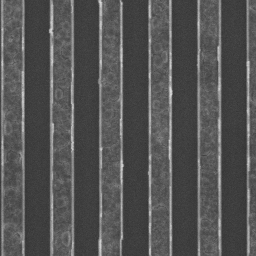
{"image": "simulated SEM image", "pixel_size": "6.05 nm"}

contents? parallel lines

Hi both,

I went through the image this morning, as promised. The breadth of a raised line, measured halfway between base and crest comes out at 132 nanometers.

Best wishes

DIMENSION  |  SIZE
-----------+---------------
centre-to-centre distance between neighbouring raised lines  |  298 nanometres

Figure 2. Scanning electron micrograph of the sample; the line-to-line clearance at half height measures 27.1 px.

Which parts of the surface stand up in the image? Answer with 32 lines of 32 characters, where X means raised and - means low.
XXX---XXX---XXX----XX----XX----X
XXX---XXX----XX----XX----XX----X
XXX---XXX----XX----XX----XX----X
XXX---XXX----XX----XX----XX----X
XXX---XXX----XX----XX----XX----X
XXX---XXX----XX----XX----XX----X
XXX---XXX----XX----XX----XX----X
XXX---XXX----XX----XX----XX----X
XXX---XXX----XX----XX----XX----X
XXX---XXX---XXX----XX----XX----X
XXX---XXX---XXX----XX----XX----X
XXX---XXX----XX----XX----XX----X
XXX---XXX----XX----XX----XX----X
XXX---XXX----XX----XX----XX----X
XXX---XXX----XX----XX----XX----X
XXX---XXX----XX----XX----XX----X
XXX---XXX----XX----XX----XX----X
XXX---XXX----XX----XX----XX----X
XXX---XXX----XX----XX----XX----X
XXX---XXX----XX----XX----XX----X
XXX---XXX----XX----XX----XX----X
XXX---XXX----XX----XX----XX----X
XXX---XXX----XX----XX----XX----X
XXX---XXX----XX----XX----XX----X
XXX---XXX----XX----XX----XX----X
XXX---XXX----XX----XX----XX----X
XXX---XXX----XX----XX----XX----X
XXX---XXX----XX----XX----XX----X
XXX---XXX----XX----XX----XX----X
XXX---XXX---XXX----XX----XX----X
XXX---XXX---XXX----XX----XXX---X
XXX---XXX---XXX----XX----XXX---X